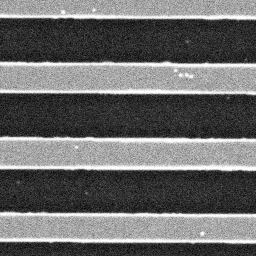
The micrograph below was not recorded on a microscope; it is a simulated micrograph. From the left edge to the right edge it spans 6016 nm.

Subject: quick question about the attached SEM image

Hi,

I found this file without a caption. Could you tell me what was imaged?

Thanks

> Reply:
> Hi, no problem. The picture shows lines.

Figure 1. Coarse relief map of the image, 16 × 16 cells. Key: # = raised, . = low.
################
................
................
................
################
################
................
................
................
################
################
................
................
################
################
................